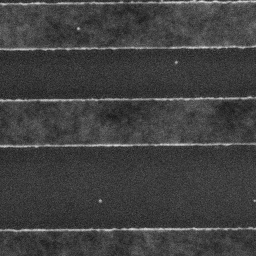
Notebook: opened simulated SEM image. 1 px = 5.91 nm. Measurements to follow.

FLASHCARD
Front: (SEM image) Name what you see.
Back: lines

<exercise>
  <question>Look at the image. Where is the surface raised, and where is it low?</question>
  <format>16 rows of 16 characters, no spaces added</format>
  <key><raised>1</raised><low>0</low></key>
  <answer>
1111111111111111
1111111111111111
1111111111111111
0000000000000000
0000000000000000
0000000000000000
1111111111111111
1111111111111111
1111111111111111
0000000000000000
0000000000000000
0000000000000000
0000000000000000
0000000000000000
1111111111111111
1111111111111111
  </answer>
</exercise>